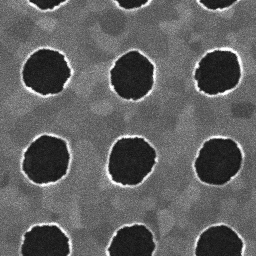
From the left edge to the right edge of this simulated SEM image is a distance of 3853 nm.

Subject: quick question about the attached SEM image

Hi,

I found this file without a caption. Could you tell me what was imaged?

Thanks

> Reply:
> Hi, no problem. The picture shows holes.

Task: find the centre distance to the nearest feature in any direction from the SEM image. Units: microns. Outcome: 1.28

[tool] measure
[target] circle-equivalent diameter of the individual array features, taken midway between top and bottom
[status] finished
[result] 706 nm